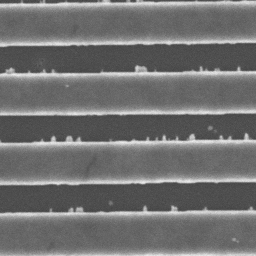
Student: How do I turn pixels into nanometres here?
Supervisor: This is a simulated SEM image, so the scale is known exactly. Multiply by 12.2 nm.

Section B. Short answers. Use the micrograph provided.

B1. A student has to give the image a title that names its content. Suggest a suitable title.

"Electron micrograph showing lines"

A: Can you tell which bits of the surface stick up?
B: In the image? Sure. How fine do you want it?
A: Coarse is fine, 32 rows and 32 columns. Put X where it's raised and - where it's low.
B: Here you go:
-----------XXXXXXXXXXXXXXXXXXXXX
XXXXXXXXXXXXXXXXXXXXXXXXXXXXXXXX
XXXXXXXXXXXXXXXXXXXXXXXXXXXXXXXX
XXXXXXXXXXXXXXXXXXXXXXXXXXXXXXXX
XXXXXXXXXXXXXXXXXXXXXXXXXXXXXXXX
XXXXXXXXXXXXXXXXX---------------
--------------------------------
--------------------------------
--------------------------------
XXXXXXXXXXXXXXXXXXXXXXXXXXXXXXXX
XXXXXXXXXXXXXXXXXXXXXXXXXXXXXXXX
XXXXXXXXXXXXXXXXXXXXXXXXXXXXXXXX
XXXXXXXXXXXXXXXXXXXXXXXXXXXXXXXX
XXXXXXXXXXXXXXXXXXXXXXXXXXXXXXXX
--------------------------------
--------------------------------
--------------------------------
--------------------------------
XXXXXXXXXXXXXXXXXXXXXXXXXXXXXXXX
XXXXXXXXXXXXXXXXXXXXXXXXXXXXXXXX
XXXXXXXXXXXXXXXXXXXXXXXXXXXXXXXX
XXXXXXXXXXXXXXXXXXXXXXXXXXXXXXXX
XXXXXXXXXXXXXXXXXXXXXXXXXXXXXXXX
--------------------------------
--------------------------------
--------------------------------
-----------------------------XXX
XXXXXXXXXXXXXXXXXXXXXXXXXXXXXXXX
XXXXXXXXXXXXXXXXXXXXXXXXXXXXXXXX
XXXXXXXXXXXXXXXXXXXXXXXXXXXXXXXX
XXXXXXXXXXXXXXXXXXXXXXXXXXXXXXXX
XXXXXXXXXXXXXXXXXXXXXXXXXXXXXXXX